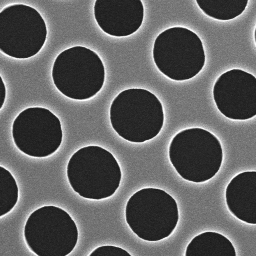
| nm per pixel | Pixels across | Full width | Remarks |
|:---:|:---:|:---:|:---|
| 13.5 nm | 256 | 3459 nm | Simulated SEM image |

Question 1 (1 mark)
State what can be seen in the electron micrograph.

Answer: holes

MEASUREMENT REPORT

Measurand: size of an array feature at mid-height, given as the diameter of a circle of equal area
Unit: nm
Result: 720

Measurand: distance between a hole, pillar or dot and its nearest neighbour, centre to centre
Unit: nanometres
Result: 961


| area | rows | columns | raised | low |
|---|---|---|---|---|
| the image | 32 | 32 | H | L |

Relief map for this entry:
HHLHHHHHHHHHLLLLLLHHHHHHHLLLLLLH
LLLLLHHHHHHHLLLLLLHHHHHHHLLLLLHH
LLLLLHHHHHHHLLLLLLHHHHHHHHHLHHHH
LLLLLLHHHHHHHLLLLHHHHLLHHHHHHHHH
LLLLLLHHHHHHHHLLHHHHLLLLLHHHHHHH
LLLLLHHHHHHHHHHHHHHLLLLLLHHHHHHH
LLLLLHHHLLLLHHHHHHHLLLLLLLHHHHHH
HHHHHHHLLLLLLHHHHHHLLLLLLLHHHHHH
HHHHHHHLLLLLLHHHHHHHLLLLLHHHHHHH
HHHHHHHLLLLLLHHHHHHHHLLLHHHHLLLL
HHHHHHHLLLLLLHHHHHHHHHHHHHHLLLLL
LHHHHHHHLLLLHHHLLLLHHHHHHHHLLLLL
LHHHHHHHHHHHHHLLLLLLHHHHHHHLLLLL
HHHHLHHHHHHHHHLLLLLLHHHHHHHLLLLL
HHLLLLLHHHHHHHLLLLLLHHHHHHHHLLLL
HHLLLLLLHHHHHHLLLLLLHHHHHHHHHHHH
HHLLLLLLHHHHHHHLLLLLHHLLLLHHHHHH
HHLLLLLLHHHHHHHHLLLHHHLLLLLHHHHH
HHLLLLLHHHLLLHHHHHHHHLLLLLLLHHHH
HHHHLLHHHLLLLLHHHHHHHLLLLLLLHHHH
HHHHHHHHHLLLLLLHHHHHHLLLLLLLHHHH
LHHHHHHHLLLLLLLHHHHHHHLLLLLHHHHL
LLHHHHHHHLLLLLLHHHHHHHHLLLHHHLLL
LLHHHHHHHLLLLLLHHHLHHHHHHHHHLLLL
LLHHHHHHHHLLLLHHHLLLLHHHHHHHLLLL
LLHHHHHHHHHHHHHHLLLLLLHHHHHHLLLL
LHHHLLLLHHHHHHHHLLLLLLHHHHHHHLLL
HHHLLLLLLHHHHHHHLLLLLLHHHHHHHHLL
HHHLLLLLLLHHHHHHLLLLLLHHHHHHHHHH
HHHLLLLLLLHHHHHHHLLLLHHHHLLLHHHH
HHHLLLLLLLHHHHHHHHHHHHHHLLLLLHHH
HHHHLLLLLHHHLLLLHHHHHHHLLLLLLHHH